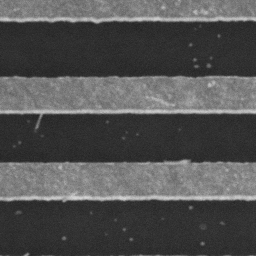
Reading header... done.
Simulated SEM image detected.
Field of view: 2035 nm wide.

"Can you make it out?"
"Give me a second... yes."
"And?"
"lines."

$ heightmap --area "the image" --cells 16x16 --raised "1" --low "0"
1111111111111111
0000000000000000
0000000000000000
0000000000000000
0000000000000000
1111111111111111
1111111111111111
0000000000000000
0000000000000000
0000000000000000
1111111111111111
1111111111111111
0000000000000000
0000000000000000
0000000000000000
0000000000000000